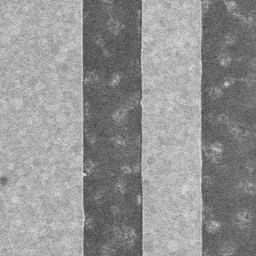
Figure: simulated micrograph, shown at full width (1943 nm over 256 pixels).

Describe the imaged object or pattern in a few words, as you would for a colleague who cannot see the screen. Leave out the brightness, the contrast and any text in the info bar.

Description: one or a few lines or trenches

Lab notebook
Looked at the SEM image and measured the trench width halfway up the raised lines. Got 452 nm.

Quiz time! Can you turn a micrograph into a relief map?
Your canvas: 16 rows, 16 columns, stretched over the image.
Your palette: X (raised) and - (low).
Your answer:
XXXXX----XXXX---
XXXXX----XXXX---
XXXXX----XXXX---
XXXXX----XXXX---
XXXXX----XXXX---
XXXXX----XXXX---
XXXXX----XXXX---
XXXXX----XXXX---
XXXXX----XXXX---
XXXXX----XXXX---
XXXXX----XXXX---
XXXXX----XXXX---
XXXXX----XXXX---
XXXXX----XXXX---
XXXXX----XXXX---
XXXXX----XXXX---